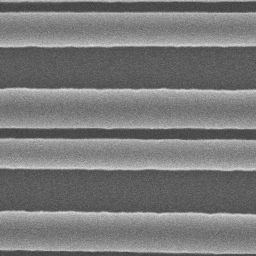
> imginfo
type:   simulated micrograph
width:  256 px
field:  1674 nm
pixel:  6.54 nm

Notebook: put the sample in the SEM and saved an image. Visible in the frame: lines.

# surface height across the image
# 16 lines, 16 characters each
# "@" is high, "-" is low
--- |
@@@@@@@@@@@@@@@@
@@@@@@@@@@@@@@@@
@@@@@@@@@@@@@@@@
----------------
----------------
----------------
@@@@@@@@@@@@@@@@
@@@@@@@@@@@@@@@@
@@@@@@@@@@@@@@@@
@@@@@@@@@@@@@@@@
-----@@@@@@@@@@@
----------------
----------------
@@@@@@@@@@@@@@@@
@@@@@@@@@@@@@@@@
@@@@@@@@@@@@@@@@